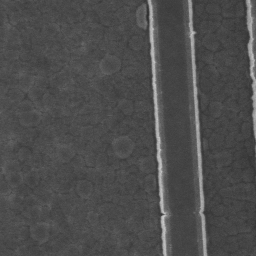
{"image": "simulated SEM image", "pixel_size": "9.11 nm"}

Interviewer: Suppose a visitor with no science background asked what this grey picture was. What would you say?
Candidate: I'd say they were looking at one or a few lines or trenches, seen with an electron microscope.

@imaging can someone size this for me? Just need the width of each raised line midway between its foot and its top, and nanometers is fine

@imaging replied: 374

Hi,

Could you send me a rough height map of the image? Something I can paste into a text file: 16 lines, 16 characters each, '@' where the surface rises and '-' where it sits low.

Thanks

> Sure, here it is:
---------@@@----
---------@@@----
---------@@@----
----------@@----
----------@@----
----------@@----
----------@@----
----------@@----
----------@@----
----------@@----
----------@@@---
----------@@@---
----------@@@---
----------@@@---
----------@@@---
----------@@@---